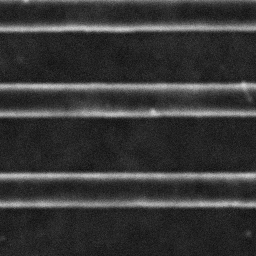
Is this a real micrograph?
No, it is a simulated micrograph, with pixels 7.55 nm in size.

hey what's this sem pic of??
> lines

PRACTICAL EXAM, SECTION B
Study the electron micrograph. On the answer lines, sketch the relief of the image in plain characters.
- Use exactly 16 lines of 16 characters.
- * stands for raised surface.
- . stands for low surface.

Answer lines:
****************
****************
................
................
................
****************
****************
................
................
................
................
****************
****************
................
................
................